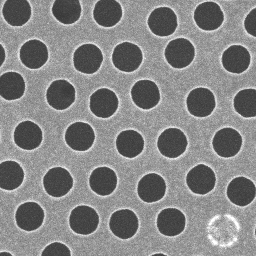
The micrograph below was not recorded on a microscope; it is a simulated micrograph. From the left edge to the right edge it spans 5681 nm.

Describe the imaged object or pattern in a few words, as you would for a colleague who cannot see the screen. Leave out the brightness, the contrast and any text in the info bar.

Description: a regular array of holes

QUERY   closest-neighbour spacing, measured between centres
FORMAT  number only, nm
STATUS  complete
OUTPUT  938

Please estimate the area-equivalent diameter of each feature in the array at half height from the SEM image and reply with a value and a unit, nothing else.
662 nm